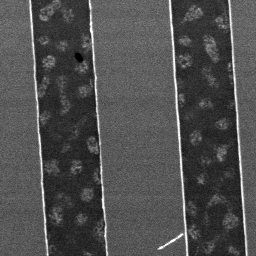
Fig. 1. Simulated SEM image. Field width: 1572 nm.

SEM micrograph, one or a few lines or trenches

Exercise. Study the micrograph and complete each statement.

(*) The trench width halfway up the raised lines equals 360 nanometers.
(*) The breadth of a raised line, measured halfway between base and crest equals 80.2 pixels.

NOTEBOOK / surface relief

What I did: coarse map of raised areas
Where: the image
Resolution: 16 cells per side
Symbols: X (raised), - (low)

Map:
XX----XXXXX---XX
XX----XXXXX---XX
XX----XXXXX---XX
XX----XXXXX----X
XX----XXXXX----X
XX----XXXXX----X
XX----XXXXX----X
XX----XXXXX----X
XX----XXXXX----X
XXX---XXXXX----X
XXX---XXXXX----X
XXX---XXXXX----X
XXX---XXXXX----X
XXX----XXXXX---X
XXX----XXXXX---X
XXX----XXXXX---X